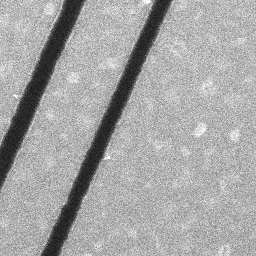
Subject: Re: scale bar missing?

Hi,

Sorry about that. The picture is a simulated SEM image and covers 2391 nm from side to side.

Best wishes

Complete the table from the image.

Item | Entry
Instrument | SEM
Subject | one or a few lines or trenches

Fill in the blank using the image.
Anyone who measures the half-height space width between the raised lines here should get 0.567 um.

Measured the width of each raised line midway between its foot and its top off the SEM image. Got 18.8 pixels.